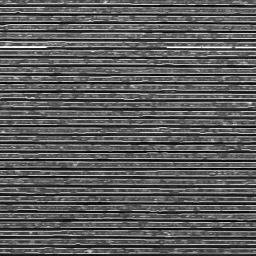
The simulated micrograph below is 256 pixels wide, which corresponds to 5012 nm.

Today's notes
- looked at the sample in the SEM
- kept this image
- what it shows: parallel lines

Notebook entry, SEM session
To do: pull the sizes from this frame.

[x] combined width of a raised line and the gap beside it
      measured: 0.168 micrometres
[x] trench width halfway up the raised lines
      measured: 51.4 nanometers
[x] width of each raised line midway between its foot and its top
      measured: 115 nanometres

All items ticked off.